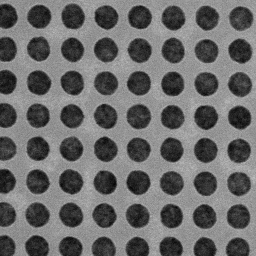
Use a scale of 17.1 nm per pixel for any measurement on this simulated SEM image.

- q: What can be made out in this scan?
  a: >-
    a regular array of holes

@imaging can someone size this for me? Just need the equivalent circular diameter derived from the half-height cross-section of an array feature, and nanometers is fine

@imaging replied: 417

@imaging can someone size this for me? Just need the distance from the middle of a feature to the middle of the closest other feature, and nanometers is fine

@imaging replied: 562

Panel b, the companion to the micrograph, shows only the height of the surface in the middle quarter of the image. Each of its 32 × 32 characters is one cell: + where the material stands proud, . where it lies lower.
++++++++++++++++++++++++++++++++
++++++++++++++++++++++++++++++++
....++++....++++.....++++....+++
.....+++.....+++.....++++.....++
.....++.......++......++......++
.....+++......++......++......++
.....+++.....+++.....++++.....++
+...+++++...++++++...++++....+++
++++++++++++++++++++++++++++++++
++++++++++++++++++++++++++++++++
...++++++...+++++....+++++..++++
....++++.....+++.....++++.....++
.....+++.....+++......++......++
.....++......+++......++......++
.....+++.....+++......++......++
....+++++....++++....++++....+++
++++++++++++++++++++++++++++++++
++++++++++++++++++++++++++++++++
...++++++..++++++..+++++++.+++++
....++++.....+++.....++++....+++
.....++......+++......++......++
.....++.......++......++......++
.....+++.....+++.....+++......++
....++++.....+++.....++++....+++
++++++++++.+++++++.++++++++.++++
++++++++++++++++++++++++++++++++
..+++++++.++++++++++++++++++++++
....++++....++++.....++++....+++
.....+++.....+++.....+++......++
.....++......++.......++......++
.....+++.....+++......++......++
....++++.....+++.....+++.....+++